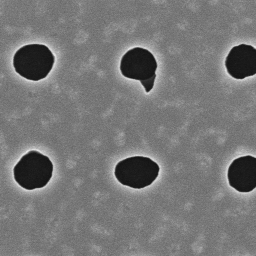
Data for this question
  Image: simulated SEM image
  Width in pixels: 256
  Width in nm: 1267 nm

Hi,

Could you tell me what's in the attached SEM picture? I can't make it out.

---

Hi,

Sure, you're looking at holes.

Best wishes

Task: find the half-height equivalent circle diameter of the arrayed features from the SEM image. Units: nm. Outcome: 188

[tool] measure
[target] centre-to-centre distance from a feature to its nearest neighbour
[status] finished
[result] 515 nm